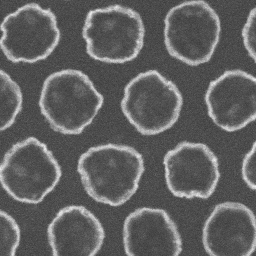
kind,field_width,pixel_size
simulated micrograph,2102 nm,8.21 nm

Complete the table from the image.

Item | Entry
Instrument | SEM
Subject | raised bodies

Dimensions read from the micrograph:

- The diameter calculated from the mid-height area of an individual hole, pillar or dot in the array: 461 nm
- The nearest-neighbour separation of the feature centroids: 78.6 px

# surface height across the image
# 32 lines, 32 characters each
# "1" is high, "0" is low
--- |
00000000000000000000000110000000
00111100000011110000011111000000
01111110000111111000011111100001
11111110000111111100011111100001
11111110000111111100011111100001
11111110000111111100011111100001
01111100000111111000001111000001
00010000000001110000000111000000
00000000000000000000000000000000
10000001110000000011000000001110
11000011111000001111100000011111
11000111111100001111110000111111
11000111111110001111110000111111
11000111111100001111110000111111
11000011111100001111110000111111
10000001111000000111100000011110
00000000000000000011000000000000
00000000000000000000000000000000
00111100000011100000001110000000
01111100000111111000011111000001
01111110001111111100011111100001
11111110001111111100011111100011
11111110000111111000011111100001
01111110000111111000011111100000
00111100000011110000000000000000
00000000000000000000000000000000
00000000111000000111000000011110
10000001111100001111100000111111
11000011111100001111110000111111
11000011111110001111110000111111
11000001111100001111110000111111
11000001111100001111110000111110